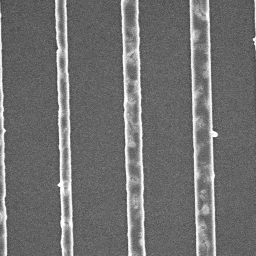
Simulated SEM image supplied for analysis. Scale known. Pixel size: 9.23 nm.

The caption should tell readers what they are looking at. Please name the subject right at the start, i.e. one or a few lines or trenches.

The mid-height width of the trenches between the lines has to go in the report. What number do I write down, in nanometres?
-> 514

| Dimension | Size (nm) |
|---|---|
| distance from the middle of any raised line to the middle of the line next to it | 639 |